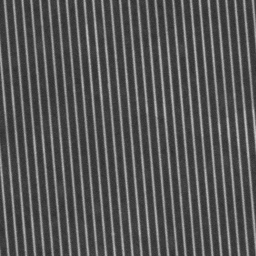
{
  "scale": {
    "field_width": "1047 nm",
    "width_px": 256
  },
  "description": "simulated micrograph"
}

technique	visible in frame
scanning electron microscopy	parallel lines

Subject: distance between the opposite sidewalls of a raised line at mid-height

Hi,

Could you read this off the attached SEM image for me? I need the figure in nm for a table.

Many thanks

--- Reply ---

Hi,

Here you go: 6.1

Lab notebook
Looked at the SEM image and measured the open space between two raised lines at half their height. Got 28.5 nm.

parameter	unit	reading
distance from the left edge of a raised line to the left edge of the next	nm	36.2